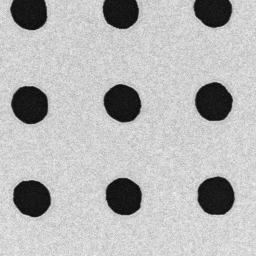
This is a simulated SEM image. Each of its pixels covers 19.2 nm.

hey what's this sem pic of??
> holes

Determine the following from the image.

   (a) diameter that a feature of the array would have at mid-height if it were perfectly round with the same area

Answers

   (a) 0.717 um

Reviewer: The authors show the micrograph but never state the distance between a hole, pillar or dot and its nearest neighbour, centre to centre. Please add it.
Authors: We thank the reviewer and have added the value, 1770 nm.